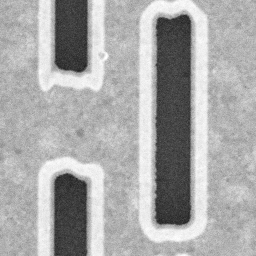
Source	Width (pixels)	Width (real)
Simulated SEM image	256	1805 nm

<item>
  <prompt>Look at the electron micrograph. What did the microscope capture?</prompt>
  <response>one or a few lines or trenches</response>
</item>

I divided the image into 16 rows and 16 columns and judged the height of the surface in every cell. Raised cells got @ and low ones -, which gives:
@@@---@@@@@-@@@@
@@@---@@@---@@@@
@@@---@@@----@@@
@@@---@@@----@@@
@@@---@@@----@@@
@@@@@@@@@----@@@
@@@@@@@@@----@@@
@@@@@@@@@----@@@
@@@@@@@@@----@@@
@@@@@@@@@----@@@
@@@--@@@@----@@@
@@@---@@@----@@@
@@@---@@@---@@@@
@@@---@@@---@@@@
@@@---@@@@--@@@@
@@@---@@@@@@@@@@